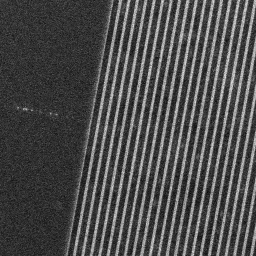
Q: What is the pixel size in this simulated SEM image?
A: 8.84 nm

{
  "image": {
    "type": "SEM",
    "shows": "parallel lines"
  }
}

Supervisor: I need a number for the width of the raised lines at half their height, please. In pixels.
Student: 2.09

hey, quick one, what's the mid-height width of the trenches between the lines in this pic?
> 55.5 nanometres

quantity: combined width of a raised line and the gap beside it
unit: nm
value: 73.3